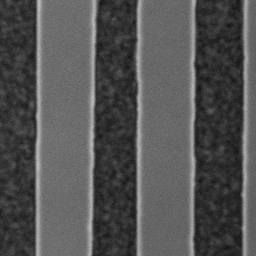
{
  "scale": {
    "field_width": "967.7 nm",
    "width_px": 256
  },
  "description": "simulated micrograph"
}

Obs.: lines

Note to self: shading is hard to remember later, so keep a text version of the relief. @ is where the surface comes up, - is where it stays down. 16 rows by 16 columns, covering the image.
--@@@@---@@@---@
--@@@@---@@@---@
--@@@@---@@@---@
--@@@@---@@@---@
--@@@@---@@@---@
--@@@@---@@@---@
--@@@@---@@@---@
--@@@@---@@@---@
--@@@@---@@@---@
--@@@@---@@@---@
--@@@@---@@@---@
--@@@@---@@@---@
--@@@@---@@@---@
--@@@@---@@@---@
--@@@@---@@@---@
--@@@@---@@@---@